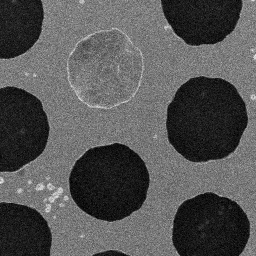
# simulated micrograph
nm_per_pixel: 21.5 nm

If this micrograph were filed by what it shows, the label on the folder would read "holes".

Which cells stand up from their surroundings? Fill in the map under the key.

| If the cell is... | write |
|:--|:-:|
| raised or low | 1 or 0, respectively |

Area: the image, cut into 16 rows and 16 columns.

0001111111000001
0001111111100001
0011111111100011
0111111111111111
1111111111111111
0111111111100001
0001111111100001
0001111111000001
0001111111000001
0001100011100001
0111100001111111
1111000001111111
1111100001110011
0001110011100001
0001111111100000
0001111111100001